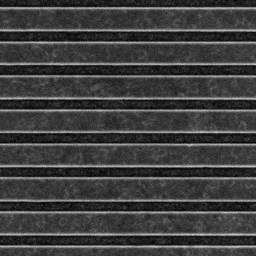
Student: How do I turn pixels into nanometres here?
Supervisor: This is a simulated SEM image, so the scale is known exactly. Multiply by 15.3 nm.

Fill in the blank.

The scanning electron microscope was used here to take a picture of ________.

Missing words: parallel lines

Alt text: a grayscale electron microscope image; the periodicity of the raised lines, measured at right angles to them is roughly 521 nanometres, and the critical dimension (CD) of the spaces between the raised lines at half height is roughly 170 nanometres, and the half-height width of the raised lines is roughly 23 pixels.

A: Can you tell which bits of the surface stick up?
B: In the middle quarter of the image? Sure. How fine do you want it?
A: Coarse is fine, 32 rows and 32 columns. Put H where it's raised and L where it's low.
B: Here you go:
LLLLLLLLLLLLLLLLLLLLLLLLLLLLLLLL
LLLLLLLLLLLLLLLLLLLLLLLLLLLLLLLL
LLLLLLLLLLLLLLLLLLLLLLLLLLLLLLLL
HHHHHHHHHHHHHHHHHHHHHHHHHHHHHHHH
HHHHHHHHHHHHHHHHHHHHHHHHHHHHHHHH
HHHHHHHHHHHHHHHHHHHHHHHHHHHHHHHH
HHHHHHHHHHHHHHHHHHHHHHHHHHHHHHHH
HHHHHHHHHHHHHHHHHHHHHHHHHHHHHHHH
HHHHHHHHHHHHHHHHHHHHHHHHHHHHHHHH
LLLLLLLLLLLLLLLLLLLLLLLLLLLLLLLL
LLLLLLLLLLLLLLLLLLLLLLLLLLLLLLLL
LLLLLLLLLLLLLLLLLLLLLLLLLLLLLLLL
HHHHHHHHHHHHHHHHHHHHHHHHHHHHHHHH
HHHHHHHHHHHHHHHHHHHHHHHHHHHHHHHH
HHHHHHHHHHHHHHHHHHHHHHHHHHHHHHHH
HHHHHHHHHHHHHHHHHHHHHHHHHHHHHHHH
HHHHHHHHHHHHHHHHHHHHHHHHHHHHHHHH
LLLLLLLLLLLLLLLLLLLLLLLLLLLLLLLL
LLLLLLLLLLLLLLLLLLLLLLLLLLLLLLLL
LLLLLLLLLLLLLLLLLLLLLLLLLLLLLLLL
HHHHHHHHHHHHHHHHHHHHHHHHHHHHHHHH
HHHHHHHHHHHHHHHHHHHHHHHHHHHHHHHH
HHHHHHHHHHHHHHHHHHHHHHHHHHHHHHHH
HHHHHHHHHHHHHHHHHHHHHHHHHHHHHHHH
HHHHHHHHHHHHHHHHHHHHHHHHHHHHHHHH
HHHHHHHHHHHHHHHHHHHHHHHHHHHHHHHH
LLLLLLLLLLLLLLLLLLLLLLLLLLLLLLLL
LLLLLLLLLLLLLLLLLLLLLLLLLLLLLLLL
LLLLLLLLLLLLLLLLLLLLLLLLLLLLLLLL
HHHHHHHHHHHHHHHHHHHHHHHHHHHHHHHH
HHHHHHHHHHHHHHHHHHHHHHHHHHHHHHHH
HHHHHHHHHHHHHHHHHHHHHHHHHHHHHHHH